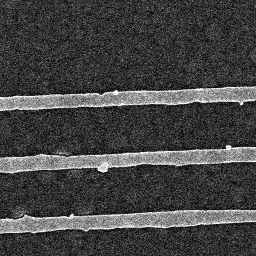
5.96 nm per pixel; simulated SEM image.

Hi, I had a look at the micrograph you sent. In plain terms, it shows one or a few lines or trenches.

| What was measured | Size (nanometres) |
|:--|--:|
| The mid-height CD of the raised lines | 81.1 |